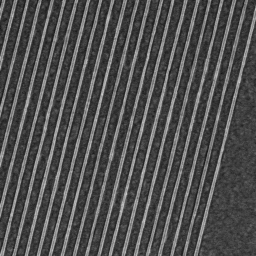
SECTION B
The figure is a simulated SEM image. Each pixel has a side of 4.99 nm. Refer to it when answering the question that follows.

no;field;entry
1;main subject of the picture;parallel lines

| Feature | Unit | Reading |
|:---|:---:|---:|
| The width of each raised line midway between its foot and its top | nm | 13.3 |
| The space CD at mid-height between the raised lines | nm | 47.2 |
